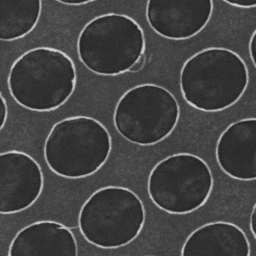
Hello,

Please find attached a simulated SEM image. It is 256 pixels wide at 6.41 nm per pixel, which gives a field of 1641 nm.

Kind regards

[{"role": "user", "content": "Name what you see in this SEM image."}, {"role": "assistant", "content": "holes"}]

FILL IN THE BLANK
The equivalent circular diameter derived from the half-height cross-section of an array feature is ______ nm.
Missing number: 391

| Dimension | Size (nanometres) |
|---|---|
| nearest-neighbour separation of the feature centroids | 490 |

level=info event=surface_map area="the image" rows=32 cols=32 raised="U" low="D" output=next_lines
DDDDDUUUUUUUUUUUUUUDDDDDDDUUUUDD
DDDDDUUUUUUUUUUUUUUDDDDDDDUUUUUU
DDDDDUUUUUUUDDDDUUUDDDDDDDUUUUUU
DDDDUUUUUUUDDDDDDUUDDDDDDUUUUUUU
DDUUUUUUUUDDDDDDDDUUUDDDUUUUUUUU
UUUUUUUUUUDDDDDDDDUUUUUUUUUUUUUD
UUUUDDDUUUDDDDDDDDUUUUUUUDDDDUUD
UUDDDDDDDUDDDDDDDUUUUUUUDDDDDDUU
UUDDDDDDDUUDDDDDUUUUUUUDDDDDDDDU
UDDDDDDDDUUUUUUUUUUUUUUDDDDDDDDU
UDDDDDDDDUUUUUUUUUUUUUUDDDDDDDDU
UUDDDDDDDUUUUUUUDDDDDUUDDDDDDDUU
UUDDDDDDUUUUUUUDDDDDDDUUDDDDDUUU
DUUUDDUUUUUUUUUDDDDDDDUUUDDDUUUU
DUUUUUUUUUUUUUDDDDDDDDUUUUUUUUUU
UUUUUUUDDDDDUUUUDDDDDDUUUUUUUDDD
UUUUUUDDDDDDDUUDDDDDDUUUUUUUDDUD
UUUUUUDDDDDDDDUUDDDDUUUUUUUUDDDD
UUUUUUDDDDDDDDUUUUUUUUUUUUUDDDDD
DDDUUUDDDDDDDUUUUUUUUUDDUUUDDDDD
DDDDUUDDDDDDDUUUUUUUDDDDDDUUDDDD
DDDDDUUDDDDUUUUUUUUDDDDDDDUUDDDD
DDDDDUUUUUUUUUUUUUUDDDDDDDUUUUUU
DDDDDUUUUUUUUUUUUUUDDDDDDDUUUUUU
DDDDDUUUUUUUDDDDDUUDDDDDDDUUUUUU
DDDDUUUUUUUDDDDDDDUUDDDDDUUUUUUU
DUUUUUUUUUDDDDDDDDUUUUDUUUUUUUUU
UUUUUUUUUUDDDDDDDDUUUUUUUUUUUUUD
UUUDDDDDUUDDDDDDDUUUUUUUUDDDDUUU
UUDDDDDDDUUDDDDDDUUUUUUUDDDDDDUU
UUDDDDDDDUUUDDDUUUUUUUUDDDDDDDDU
UDDDDDDDDDUUUUUUUUUUUUUDDDDDDDDU